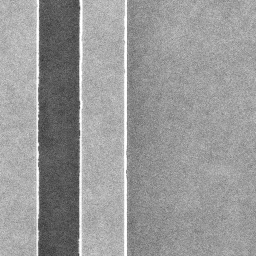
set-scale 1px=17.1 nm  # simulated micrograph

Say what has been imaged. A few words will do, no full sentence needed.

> lines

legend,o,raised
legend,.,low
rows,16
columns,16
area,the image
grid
oo...ooo........
oo...ooo........
oo...ooo........
oo...ooo........
oo...ooo........
oo...ooo........
oo...ooo........
oo...ooo........
oo...ooo........
oo...ooo........
oo...ooo........
oo...ooo........
oo...ooo........
oo...ooo........
oo...ooo........
oo...ooo........